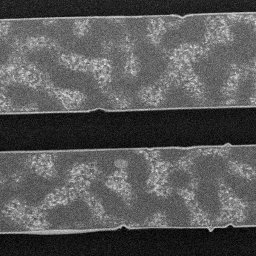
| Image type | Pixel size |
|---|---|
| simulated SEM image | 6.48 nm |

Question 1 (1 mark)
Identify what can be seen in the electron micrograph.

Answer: one or a few lines or trenches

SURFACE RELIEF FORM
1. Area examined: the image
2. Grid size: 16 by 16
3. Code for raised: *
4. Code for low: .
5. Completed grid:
................
****************
****************
****************
****************
****************
****************
................
................
..**************
****************
****************
****************
****************
**.*............
................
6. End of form